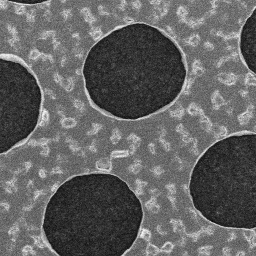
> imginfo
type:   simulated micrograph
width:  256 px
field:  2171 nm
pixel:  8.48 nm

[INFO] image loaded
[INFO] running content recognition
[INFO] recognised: holes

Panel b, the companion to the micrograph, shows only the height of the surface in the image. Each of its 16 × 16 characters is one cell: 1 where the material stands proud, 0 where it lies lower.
1111111111111111
1111111101111110
1111110000011110
1111100000011110
0011100000001111
0011100000011111
0001110000011111
0011111111111111
0011111111111110
1111111111111000
1111111111110000
1111000011110000
1110000001110000
1110000001111000
1110000001111111
1110000011111111